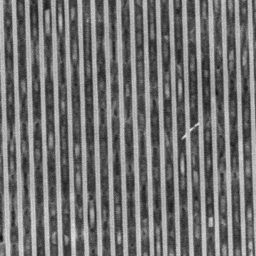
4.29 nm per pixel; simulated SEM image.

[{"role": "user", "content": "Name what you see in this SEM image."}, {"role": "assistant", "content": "parallel lines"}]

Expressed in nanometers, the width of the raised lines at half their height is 15.5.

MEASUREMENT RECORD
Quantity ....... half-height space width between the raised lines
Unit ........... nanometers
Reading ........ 39.1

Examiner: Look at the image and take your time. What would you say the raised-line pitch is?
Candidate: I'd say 56.1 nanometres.